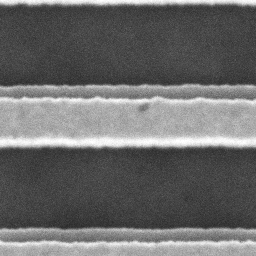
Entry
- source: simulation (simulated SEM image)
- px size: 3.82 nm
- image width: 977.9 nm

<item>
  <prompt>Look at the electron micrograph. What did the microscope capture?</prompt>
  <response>lines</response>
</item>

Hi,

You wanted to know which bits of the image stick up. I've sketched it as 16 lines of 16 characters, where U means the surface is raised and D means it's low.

DDDDDDDDDDDDDDDD
DDDDDDDDDDDDDDDD
DDDDDDDDDDDDDDDD
DDDDDDDDDDDDDDDD
DDDDDDDDDDDDDDDD
UUUUUUUUUUUUUUUU
UUUUUUUUUUUUUUUU
UUUUUUUUUUUUUUUU
UUUUUUUUUUUUUUUU
DDDDDDDDDDDDDDDD
DDDDDDDDDDDDDDDD
DDDDDDDDDDDDDDDD
DDDDDDDDDDDDDDDD
DDDDDDDDDDDDDDDD
UUUUUUUUUUUUUUUU
UUUUUUUUUUUUUUUU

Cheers